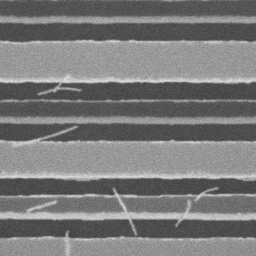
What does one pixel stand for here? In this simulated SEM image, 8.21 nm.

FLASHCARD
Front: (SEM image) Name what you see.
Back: lines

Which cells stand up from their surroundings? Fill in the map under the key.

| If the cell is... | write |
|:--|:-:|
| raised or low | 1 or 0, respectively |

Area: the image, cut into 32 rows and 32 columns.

11111111111111111111111111111111
11111111111111111111111111111111
11111110111111111111101111010111
00000000000000000000000000000000
00000000000000000000000000000000
11111111111111111111111111111111
11111111111111111111111111111111
11111111111111111111111111111111
11111111111111111111111111111111
11111111111111111111111111111111
00000000000000000000000000000000
00000000000000000000000000000000
00000000000000000000000000000000
11111111111111111111111111111111
11111111111111111111111111111111
00000000000000000000000000000000
00000000000000000000000000000000
00001000000000000000000000000000
11111111111111111111111111111111
11111111111111111111111111111111
11111111111111111111111111111111
11111111111111111111111111111111
00000000000000000000000000000000
00000000000000000000000000000000
00011111111111111000111111111111
11111111111111111111111111111111
11111111111111111111111111111111
00000000000000000000000000000000
00000000000000000000000000000000
00000000000000000000000000000000
11111111111111111111111111111111
11111111111111111111111111111111